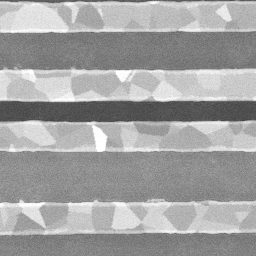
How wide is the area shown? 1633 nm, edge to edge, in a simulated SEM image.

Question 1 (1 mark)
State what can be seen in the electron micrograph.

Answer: lines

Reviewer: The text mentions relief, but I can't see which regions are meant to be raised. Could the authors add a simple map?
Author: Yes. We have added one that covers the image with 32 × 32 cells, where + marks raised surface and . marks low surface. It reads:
++++++++++++++++++++++++++++++++
++++++++++++++++++++++++++++++++
++++++++++++++++++++++++++++++++
++++++++++++++++++++++++++++++++
................................
................................
................................
................................
................................
++++++++++++++++++++++++++++++++
++++++++++++++++++++++++++++++++
++++++++++++++++++++++++++++++++
++++++++++++++++++++++++++++++++
................................
................................
++++++++++++++++++++++++++++++++
++++++++++++++++++++++++++++++++
++++++++++++++++++++++++++++++++
++++++++++++++++++++++++++++++++
................................
................................
................................
................................
................................
................................
++++++++++++++++++++++++++++++++
++++++++++++++++++++++++++++++++
++++++++++++++++++++++++++++++++
++++++++++++++++++++++++++++++++
................................
................................
................................